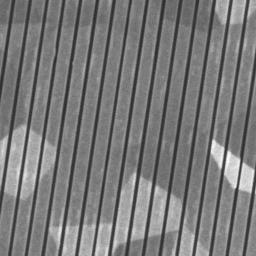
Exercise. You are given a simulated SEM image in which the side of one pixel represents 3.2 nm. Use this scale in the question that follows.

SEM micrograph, parallel lines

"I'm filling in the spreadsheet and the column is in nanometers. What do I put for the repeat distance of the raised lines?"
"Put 53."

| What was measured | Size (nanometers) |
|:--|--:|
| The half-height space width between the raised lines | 12.6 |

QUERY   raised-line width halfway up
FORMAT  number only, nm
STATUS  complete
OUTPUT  40.7